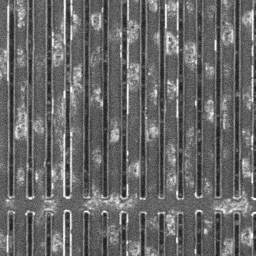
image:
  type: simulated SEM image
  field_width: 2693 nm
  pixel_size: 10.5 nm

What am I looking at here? parallel lines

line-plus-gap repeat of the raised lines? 0.198 um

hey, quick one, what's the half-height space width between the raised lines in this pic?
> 130 nm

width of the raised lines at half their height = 6.12 px